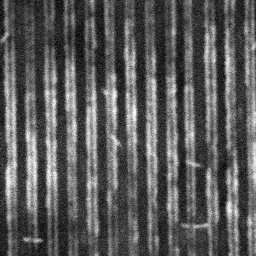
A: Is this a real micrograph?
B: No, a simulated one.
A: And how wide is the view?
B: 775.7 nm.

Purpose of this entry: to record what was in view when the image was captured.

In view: parallel lines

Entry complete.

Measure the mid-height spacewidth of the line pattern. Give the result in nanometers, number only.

34.5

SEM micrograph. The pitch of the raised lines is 60.8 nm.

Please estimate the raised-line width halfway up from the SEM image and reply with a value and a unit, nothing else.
26.5 nanometers